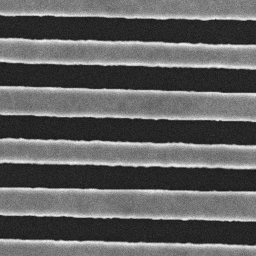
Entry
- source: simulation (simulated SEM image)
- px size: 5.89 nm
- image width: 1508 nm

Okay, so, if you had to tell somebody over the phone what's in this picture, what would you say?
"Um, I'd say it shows lines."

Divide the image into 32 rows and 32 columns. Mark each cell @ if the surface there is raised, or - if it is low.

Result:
@@@@@@@@@@@@@@@@@@@@@@@@@@@@@@@@
@@@@@@@@@@@@@@@@@@@@@@@@@@@@@@@@
--------------------------------
--------------------------------
--------------------------------
@@@@@@@@@@@@@@@@@@@@@@@@@@------
@@@@@@@@@@@@@@@@@@@@@@@@@@@@@@@@
@@@@@@@@@@@@@@@@@@@@@@@@@@@@@@@@
---------------------------@@@@@
--------------------------------
--------------------------------
@@@@@@@@@@@@@@@@@@@@@@@@@-------
@@@@@@@@@@@@@@@@@@@@@@@@@@@@@@@@
@@@@@@@@@@@@@@@@@@@@@@@@@@@@@@@@
------@@@@@@@@@@@@@@@@@@@@@@@@@@
--------------------------------
--------------------------------
@@@@@@@@@-----------------------
@@@@@@@@@@@@@@@@@@@@@@@@@@@@@@@@
@@@@@@@@@@@@@@@@@@@@@@@@@@@@@@@@
--------@-@@@@@@@@@@@@@@@@@@@@@@
--------------------------------
--------------------------------
--------------------------------
@@@@@@@@@@@@@@@@@@@@@@@@@@@@@@@@
@@@@@@@@@@@@@@@@@@@@@@@@@@@@@@@@
@@@@@@@@@@@@@@@@@@@@@@@@@@@@@@@@
---------------------------@@@@@
--------------------------------
--------------------------------
@@@@@@@@@@@@@@@@@@@@@@@@--------
@@@@@@@@@@@@@@@@@@@@@@@@@@@@@@@@